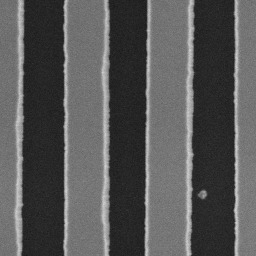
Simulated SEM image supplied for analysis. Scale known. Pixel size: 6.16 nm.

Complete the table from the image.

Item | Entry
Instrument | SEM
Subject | lines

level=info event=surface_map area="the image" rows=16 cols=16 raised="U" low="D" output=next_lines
UDDDUUUDDUUUDDDU
UDDDUUUDDUUUDDDU
UDDDUUUDDUUUDDDU
UDDDUUUDDUUUDDDU
UDDDUUUDDUUUDDDU
UDDDUUUDDUUUDDDU
UDDDUUUDDUUUDDDU
UDDDUUUDDUUUDDDU
UDDDUUUDDUUUDDDU
UDDDUUUDDUUUDDDU
UDDDUUUDDUUUDDDU
UDDDUUUDDUUUDDDU
UDDDUUUDDUUUDDDU
UDDDUUUDDUUUDDDU
UDDDUUUDDUUUDDDU
UDDDUUUDDUUUDDDU